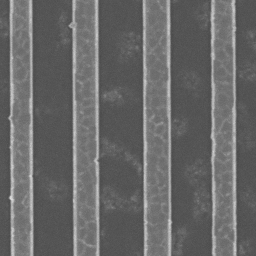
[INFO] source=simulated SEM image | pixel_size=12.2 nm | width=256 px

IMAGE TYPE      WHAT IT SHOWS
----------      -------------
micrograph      one or a few lines or trenches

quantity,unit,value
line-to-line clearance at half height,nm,518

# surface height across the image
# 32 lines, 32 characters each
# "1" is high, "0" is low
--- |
01110000011100000011100000011000
01110000011100000011100000011000
01110000011100000011100000111000
01110000011100000011100000011000
01110000011100000011100000011000
01110000011100000011100000111000
01110000011100000011100000111000
01110000011100000011100000011000
01110000011100000011100000011000
01110000011100000011100000011000
01110000011100000011100000011000
01110000011100000011100000011000
01110000011100000011100000011000
01110000011100000011100000011000
01110000011100000011100000011000
01110000011100000011100000011000
01110000011100000011100000011000
01110000011100000011100000011000
01110000011100000011100000011000
01110000011100000011100000011000
01110000011100000011100000011000
01110000011100000011100000011000
00110000011100000011100000011000
01110000011100000011100000011000
01110000011100000011100000011000
00110000011100000011100000011000
01110000011100000011100000011000
01110000011100000011100000011000
01110000011100000011100000011000
01110000011100000011100000011000
01110000011100000011100000011000
00110000011100000011100000011000